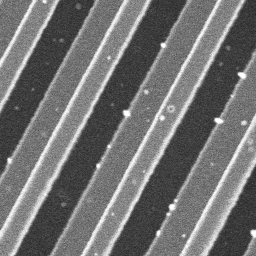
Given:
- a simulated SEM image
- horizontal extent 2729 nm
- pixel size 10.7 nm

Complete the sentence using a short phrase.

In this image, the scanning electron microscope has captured lines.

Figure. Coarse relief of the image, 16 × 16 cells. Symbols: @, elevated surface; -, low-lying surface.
@@@---@@@--@@@@-
@@@--@@@@--@@@--
@@---@@@--@@@@--
@@--@@@@--@@@---
@---@@@--@@@@--@
@--@@@---@@@---@
---@@@--@@@@--@@
--@@@---@@@---@@
-@@@@--@@@@--@@@
-@@@---@@@---@@@
@@@@--@@@@--@@@@
@@@---@@@---@@@-
@@@--@@@@--@@@@-
@@---@@@--@@@@--
@@--@@@@--@@@@--
@--@@@@--@@@@---